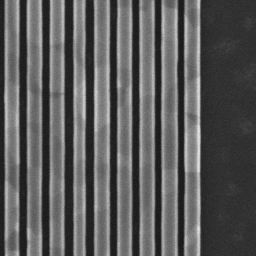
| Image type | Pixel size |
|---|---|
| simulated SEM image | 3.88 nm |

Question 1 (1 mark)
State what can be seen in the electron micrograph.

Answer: parallel lines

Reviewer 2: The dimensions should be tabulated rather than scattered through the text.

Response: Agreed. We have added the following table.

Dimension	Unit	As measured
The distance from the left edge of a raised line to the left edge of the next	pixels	22.5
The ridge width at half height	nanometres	51.3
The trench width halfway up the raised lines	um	0.0344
